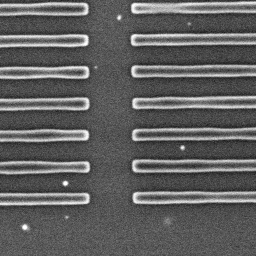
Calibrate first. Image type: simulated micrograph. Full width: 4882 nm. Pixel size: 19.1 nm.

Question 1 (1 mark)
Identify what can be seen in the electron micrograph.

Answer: groups of lines, slits or small figures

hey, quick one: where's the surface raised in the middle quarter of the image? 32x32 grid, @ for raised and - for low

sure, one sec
--------------------------------
@@@@@@-----------@@@@@@@@@@@@@@@
@@@@@@-----------@@@@@@@@@@@@@@@
--------------------------------
--------------------------------
--------------------------------
--------------------------------
--------------------------------
--------------------------------
@@@@@@-----------@@@@@@@@@@@@@@@
@@@@@@-----------@@@@@@@@@@@@@@@
--------------------------------
--------------------------------
--------------------------------
--------------------------------
--------------------------------
----------------------@@@@@@@@@@
@@@@@@-----------@@@@@@@@@@@@@@@
@@@@@@-----------@@@@@@@@@@@@@@@
--------------------------------
--------------------------------
--------------------------------
--------------------------------
--------------------------------
-----------------@@@@@@@@@@@@@@@
@@@@@@-----------@@@@@@@@@@@@@@@
@@@@@@-----------@@@@@@@@@@@@@@@
--------------------------------
--------------------------------
--------------------------------
--------------------------------
--------------------------------